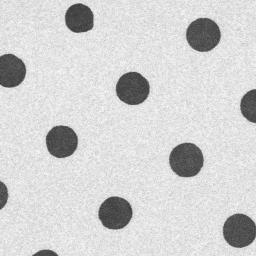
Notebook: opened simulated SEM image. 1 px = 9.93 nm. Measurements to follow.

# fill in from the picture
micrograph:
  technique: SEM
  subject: holes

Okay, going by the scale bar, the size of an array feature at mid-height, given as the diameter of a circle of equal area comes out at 0.335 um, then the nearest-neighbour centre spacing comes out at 881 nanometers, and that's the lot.